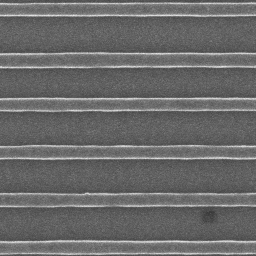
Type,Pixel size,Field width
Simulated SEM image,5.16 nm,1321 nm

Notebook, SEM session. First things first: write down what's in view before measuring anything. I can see parallel lines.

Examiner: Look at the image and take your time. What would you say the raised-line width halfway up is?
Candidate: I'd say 0.0646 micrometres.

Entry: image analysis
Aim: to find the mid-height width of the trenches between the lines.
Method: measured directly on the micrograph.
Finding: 184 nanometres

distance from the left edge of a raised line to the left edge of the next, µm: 0.246